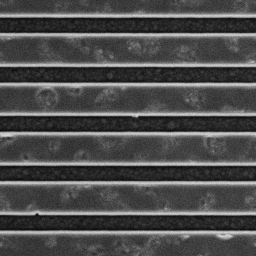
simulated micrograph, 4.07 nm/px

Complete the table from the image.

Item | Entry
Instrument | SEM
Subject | parallel lines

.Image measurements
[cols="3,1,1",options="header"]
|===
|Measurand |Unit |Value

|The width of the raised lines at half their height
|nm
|130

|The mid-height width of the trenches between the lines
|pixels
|17.7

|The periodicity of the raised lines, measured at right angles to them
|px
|49.3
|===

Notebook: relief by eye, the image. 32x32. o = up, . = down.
oooooooooooooooooooooooooooooooo
oooooooooooooooooooooooooooooooo
................................
................................
oooooooooooooooooooooooooooooooo
oooooooooooooooooooooooooooooooo
oooooooooooooooooooooooooooooooo
oooooooooooooooooooooooooooooooo
................................
................................
................................
oooooooooooooooooooooooooooooooo
oooooooooooooooooooooooooooooooo
oooooooooooooooooooooooooooooooo
................................
................................
................................
oooooooooooooooooooooooooooooooo
oooooooooooooooooooooooooooooooo
oooooooooooooooooooooooooooooooo
...ooooooooooooooooooooooooooooo
................................
................................
oooooooooooooooooooooooooooooooo
oooooooooooooooooooooooooooooooo
oooooooooooooooooooooooooooooooo
oooooooooooooooooooooooooooooooo
................................
................................
oooooooooooooooooooooooooooooooo
oooooooooooooooooooooooooooooooo
oooooooooooooooooooooooooooooooo